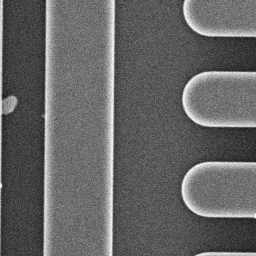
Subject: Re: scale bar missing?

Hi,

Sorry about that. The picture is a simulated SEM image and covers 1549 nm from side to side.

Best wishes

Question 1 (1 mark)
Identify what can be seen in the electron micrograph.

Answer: groups of lines, slits or small figures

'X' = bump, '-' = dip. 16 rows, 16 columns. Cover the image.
---XXXX-----XXXX
---XXXX-----XXXX
---XXXX---------
---XXXX---------
---XXXX---------
---XXXX-----XXXX
---XXXX----XXXXX
---XXXX-----XXXX
---XXXX---------
---XXXX---------
---XXXX-----XXXX
---XXXX----XXXXX
---XXXX-----XXXX
---XXXX------XXX
---XXXX---------
---XXXX---------